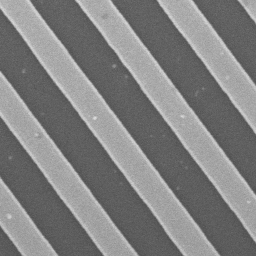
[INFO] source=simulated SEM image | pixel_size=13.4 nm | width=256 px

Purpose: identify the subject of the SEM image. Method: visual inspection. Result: lines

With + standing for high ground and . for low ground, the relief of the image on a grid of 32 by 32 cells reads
++++......++++......++++......++
+++++......++++......++++......+
.++++......+++++.....+++++......
..++++......++++......+++++.....
...++++......++++......++++.....
...+++++......++++......++++....
....++++......+++++.....+++++...
.....++++......++++......+++++..
......++++......++++......++++..
......+++++......++++......++++.
+......++++......+++++.....+++++
++......++++......++++......++++
+++......++++......++++......+++
+++......+++++......++++......++
++++......++++......+++++.....++
.++++......++++......++++......+
..++++......++++......++++......
..++++......+++++.....+++++.....
...++++......++++......+++++....
....++++......++++......++++....
.....++++.....+++++......++++...
.....++++......+++++......++++..
......++++......++++......++++..
+......++++......++++......++++.
++.....+++++.....+++++......++++
++......++++......+++++.....++++
+++......++++......++++......+++
++++......++++......++++......++
+++++.....+++++.....+++++......+
.++++......++++......+++++.....+
..++++......++++......++++......
..+++++......++++......++++.....